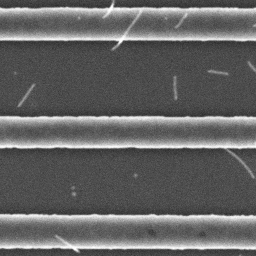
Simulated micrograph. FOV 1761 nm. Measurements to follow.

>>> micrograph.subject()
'lines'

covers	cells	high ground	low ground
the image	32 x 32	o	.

................................
oooooooooooooooooooooooooooooooo
oooooooooooooooooooooooooooooooo
oooooooooooooooooooooooooooooooo
oooooooooooooooooooooooooooooooo
................................
................................
................................
................................
................................
................................
................................
................................
................................
................................
oooooooooooooooooooooooooooooooo
oooooooooooooooooooooooooooooooo
oooooooooooooooooooooooooooooooo
................................
................................
................................
................................
................................
................................
................................
................................
................................
oooooooooooooooooooooooooooooooo
oooooooooooooooooooooooooooooooo
oooooooooooooooooooooooooooooooo
oooooooooooooooooooooooooooooooo
................................